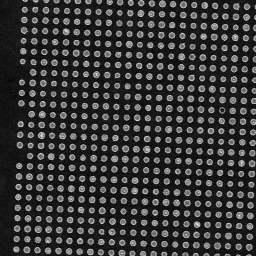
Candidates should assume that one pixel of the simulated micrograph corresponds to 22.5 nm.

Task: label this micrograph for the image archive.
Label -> a regular array of raised bodies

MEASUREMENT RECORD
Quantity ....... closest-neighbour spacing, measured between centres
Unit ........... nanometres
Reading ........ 230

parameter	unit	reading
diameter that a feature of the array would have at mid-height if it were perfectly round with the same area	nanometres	132